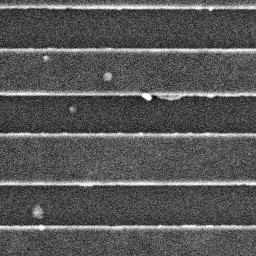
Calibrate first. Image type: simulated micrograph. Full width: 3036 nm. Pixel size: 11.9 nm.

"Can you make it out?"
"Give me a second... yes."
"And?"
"lines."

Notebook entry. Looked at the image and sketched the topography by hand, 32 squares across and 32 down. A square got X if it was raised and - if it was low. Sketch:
XXXXXXXXXXXXXXXXXXXXXXXXXXXXXXXX
--------------------------------
--------------------------------
--------------------------------
--------------------------------
--------------------------------
XXXXXXXXXXXXXXXXXXXXXXXXXXXXXXXX
XXXXXXXXXXXXXXXXXXXXXXXXXXXXXXXX
XXXXXXXXXXXXXXXXXXXXXXXXXXXXXXXX
XXXXXXXXXXXXXXXXXXXXXXXXXXXXXXXX
XXXXXXXXXXXXXXXXXXXXXXXXXXXXXXXX
XXXXXXXXXXXXXXXXXXXXXXXXXXXXXXXX
--------------------------------
--------------------------------
--------------------------------
--------------------------------
--------------------------------
XXXXXXXXXXXXXXXXXXXXXXXXXXXXXXXX
XXXXXXXXXXXXXXXXXXXXXXXXXXXXXXXX
XXXXXXXXXXXXXXXXXXXXXXXXXXXXXXXX
XXXXXXXXXXXXXXXXXXXXXXXXXXXXXXXX
XXXXXXXXXXXXXXXXXXXXXXXXXXXXXXXX
XXXXXXXXXXXXXXXXXXXXXXXXXXXXXXXX
--------------------------------
--------------------------------
--------------------------------
--------------------------------
--------------------------------
XXXXXXXXXXXXXXXXXXXXXXXXXXXXXXXX
XXXXXXXXXXXXXXXXXXXXXXXXXXXXXXXX
XXXXXXXXXXXXXXXXXXXXXXXXXXXXXXXX
XXXXXXXXXXXXXXXXXXXXXXXXXXXXXXXX